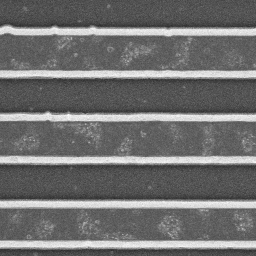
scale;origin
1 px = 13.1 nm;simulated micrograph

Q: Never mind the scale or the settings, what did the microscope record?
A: one or a few lines or trenches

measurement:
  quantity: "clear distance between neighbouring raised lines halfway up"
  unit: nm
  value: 571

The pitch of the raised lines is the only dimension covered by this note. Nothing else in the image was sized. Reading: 1120 nanometers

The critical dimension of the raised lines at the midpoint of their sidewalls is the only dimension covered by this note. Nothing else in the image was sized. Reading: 558 nanometers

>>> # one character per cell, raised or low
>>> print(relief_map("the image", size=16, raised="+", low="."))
................
................
++++++++++++++++
++++++++++++++++
++++++++++++++++
................
................
++++++++++++++++
++++++++++++++++
++++++++++++++++
................
................
................
++++++++++++++++
++++++++++++++++
................